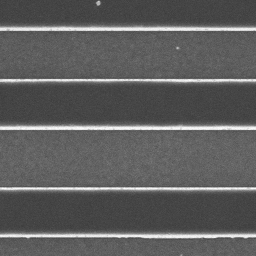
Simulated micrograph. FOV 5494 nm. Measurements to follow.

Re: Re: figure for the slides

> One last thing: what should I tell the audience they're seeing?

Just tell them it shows lines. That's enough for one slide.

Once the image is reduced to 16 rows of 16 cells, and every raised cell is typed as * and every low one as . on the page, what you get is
****************
****************
................
................
................
****************
****************
****************
................
................
................
................
****************
****************
****************
................